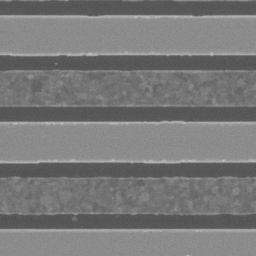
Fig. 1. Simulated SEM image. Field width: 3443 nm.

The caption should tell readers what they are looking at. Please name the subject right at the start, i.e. lines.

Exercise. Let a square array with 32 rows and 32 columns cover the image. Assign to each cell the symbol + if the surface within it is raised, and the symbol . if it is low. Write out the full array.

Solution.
................................
................................
++++++++++++++++++++++++++++++++
++++++++++++++++++++++++++++++++
++++++++++++++++++++++++++++++++
++++++++++++++++++++++++++++++++
++++++++++++++++++++++++++++++++
................................
................................
++++++++++++++++++++++++++++++++
++++++++++++++++++++++++++++++++
++++++++++++++++++++++++++++++++
++++++++++++++++++++++++++++++++
................................
................................
++++++++++++++++++++++++++++++++
++++++++++++++++++++++++++++++++
++++++++++++++++++++++++++++++++
++++++++++++++++++++++++++++++++
++++++++++++++++++++++++++++++++
................................
................................
++++++++++++++++++++++++++++++++
++++++++++++++++++++++++++++++++
++++++++++++++++++++++++++++++++
++++++++++++++++++++++++++++++++
++++++++++++++++++++++++++++++++
................................
................................
++++++++++++++++++++++++++++++++
++++++++++++++++++++++++++++++++
++++++++++++++++++++++++++++++++